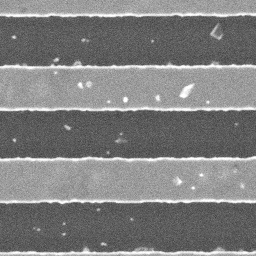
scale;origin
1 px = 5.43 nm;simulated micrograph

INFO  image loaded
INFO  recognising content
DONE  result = lines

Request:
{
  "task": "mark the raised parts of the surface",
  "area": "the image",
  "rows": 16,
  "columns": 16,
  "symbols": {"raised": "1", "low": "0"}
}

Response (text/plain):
1111111111111111
0000000000000000
0000000000000000
0000000000000000
1111111111111111
1111111111111111
1111111111111111
0000000000000000
0000000000000000
0000000000000000
1111111111111111
1111111111111111
1111111111111111
0000000000000000
0000000000000000
0000000000000000